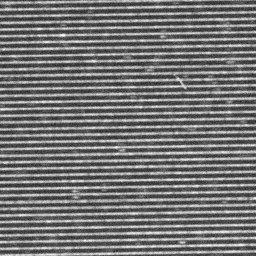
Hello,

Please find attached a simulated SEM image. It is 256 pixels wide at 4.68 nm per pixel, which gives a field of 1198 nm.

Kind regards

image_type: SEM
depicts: parallel lines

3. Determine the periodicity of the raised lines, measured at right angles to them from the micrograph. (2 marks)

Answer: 6.65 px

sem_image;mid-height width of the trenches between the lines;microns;0.0234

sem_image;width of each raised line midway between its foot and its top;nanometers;9.4